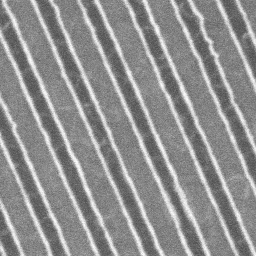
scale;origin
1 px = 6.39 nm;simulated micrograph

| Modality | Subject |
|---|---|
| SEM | parallel lines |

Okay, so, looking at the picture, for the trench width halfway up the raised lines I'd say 161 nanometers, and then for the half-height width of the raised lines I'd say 113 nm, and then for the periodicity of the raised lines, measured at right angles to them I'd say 0.272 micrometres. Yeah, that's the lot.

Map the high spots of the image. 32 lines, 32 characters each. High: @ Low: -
@---@@@---@@----@@----@@---@@@--
@----@@---@@@---@@@---@@@---@@--
@@---@@@---@@----@@---@@@---@@@-
@@----@@---@@@---@@@---@@----@@-
@@@---@@----@@----@@---@@@---@@@
-@@---@@@---@@@---@@----@@----@@
-@@----@@----@@---@@@---@@@---@@
-@@@---@@@---@@----@@----@@---@@
--@@----@@---@@@---@@@---@@@---@
--@@@---@@@---@@----@@----@@---@
---@@----@@---@@@---@@@---@@----
---@@@---@@----@@----@@---@@@---
----@@---@@@---@@@---@@----@@---
@---@@----@@----@@---@@@---@@@--
@---@@@---@@@---@@@---@@----@@--
@@---@@----@@----@@---@@@---@@@-
@@---@@@---@@@---@@----@@----@@-
@@----@@----@@---@@@---@@@---@@-
@@@---@@@---@@----@@----@@----@@
-@@----@@---@@@---@@@---@@@---@@
-@@@---@@@---@@----@@----@@---@@
--@@----@@---@@@---@@@---@@----@
--@@@---@@----@@----@@---@@@---@
---@@---@@@---@@@---@@----@@----
---@@----@@----@@---@@@---@@@---
---@@@---@@@---@@@---@@----@@---
@---@@----@@----@@---@@@---@@@--
@---@@@---@@@---@@----@@----@@--
@----@@----@@---@@@---@@@---@@--
@@---@@@---@@@---@@----@@---@@@-
@@----@@---@@@---@@@---@@----@@-
@@@---@@----@@----@@----@@---@@@